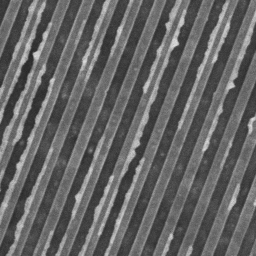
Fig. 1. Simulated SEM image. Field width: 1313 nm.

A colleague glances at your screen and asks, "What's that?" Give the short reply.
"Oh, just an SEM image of parallel lines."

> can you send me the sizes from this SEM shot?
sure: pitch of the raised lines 116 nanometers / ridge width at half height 0.0574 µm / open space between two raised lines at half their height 58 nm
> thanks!